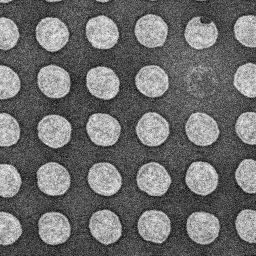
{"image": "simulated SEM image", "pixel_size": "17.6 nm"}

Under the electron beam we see a regular array of raised bodies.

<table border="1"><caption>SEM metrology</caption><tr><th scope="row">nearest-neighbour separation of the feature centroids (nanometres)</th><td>847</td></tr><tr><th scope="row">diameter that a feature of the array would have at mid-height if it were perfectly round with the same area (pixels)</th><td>32.3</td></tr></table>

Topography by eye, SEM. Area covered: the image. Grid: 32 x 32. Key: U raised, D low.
DDDDDDDDDDDDDDDDDDDDDDDDDDDDDDDD
DDDDDDDDDDDDDDDDDDDDDDDDDDDDDDDD
UDDDDUUDDDDUUUDDDUUUDDDDUDDDDDUU
UUDDDUUUDDDUUUUDDUUUUDDUUUUDDUUU
UUDDDUUUUDDUUUUDDUUUUDDUUUUDDDUU
UUDDDUUUDDDDUUDDDDUUDDDDUUUDDDDU
DDDDDDDDDDDDDDDDDDDDDDDDDDDDDDDD
DDDDDDDDDDDDDDDDDDDDDDDDDDDDDDDD
UDDDDDUUDDDDUDDDDDUUDDDDDDDDDDUU
UUDDDUUUUDDUUUUDDUUUUDDDDDDDDUUU
UUDDDUUUUDDUUUUDDUUUUDDDDDDDDUUU
UUDDDUUUDDDUUUUDDDUUUDDDDDDDDDUU
DDDDDDDDDDDDDDDDDDDDDDDDDDDDDDDD
DDDDDDDDDDDDDDDDDDDDDDDDDDDDDDDD
UDDDDDUDDDDDUUDDDDUUDDDDUUDDDDUU
UUDDDUUUUDDUUUUDDUUUUDDUUUUDDDUU
UUDDDUUUUDDUUUUDDUUUUDDUUUUDDDUU
UUDDDUUUDDDDUUUDDDUUDDDDUUUDDDUU
DDDDDDDDDDDDDDDDDDDDDDDDDDDDDDDD
DDDDDDDDDDDDDDDDDDDDDDDDDDDDDDDD
DDDDDDUDDDDDUUDDDDUUDDDDUUDDDDUU
UUDDDUUUDDDUUUUDDUUUUDDUUUUDDDUU
UUUDDUUUUDDUUUUDDUUUUDDUUUUDDDUU
UUDDDUUUDDDDUUUDDDUUUDDDUUUDDDUU
UDDDDDDDDDDDDDDDDDDDDDDDDDDDDDDD
DDDDDDDDDDDDDDDDDDDDDDDDDDDDDDDD
DDDDDDDDDDDDUUDDDDUUDDDDDDDDDDUU
UUDDDUUUDDDUUUUDDUUUUDDUUUUDDDUU
UUUDDUUUUDDUUUUDDUUUUDDUUUUDDDUU
UUDDDUUUUDDDUUUDDDUUUDDDUUUDDDUU
DDDDDDUDDDDDDDDDDDDDDDDDDDDDDDDD
DDDDDDDDDDDDDDDDDDDDDDDDDDDDDDDD